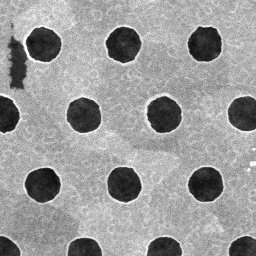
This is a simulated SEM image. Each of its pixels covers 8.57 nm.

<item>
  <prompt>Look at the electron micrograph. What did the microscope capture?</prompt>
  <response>a regular array of holes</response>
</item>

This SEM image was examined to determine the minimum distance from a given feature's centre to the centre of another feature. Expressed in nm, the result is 687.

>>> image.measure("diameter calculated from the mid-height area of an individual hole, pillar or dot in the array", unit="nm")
308